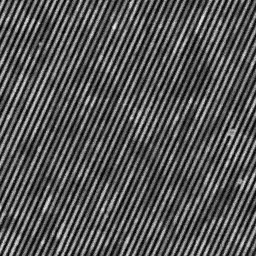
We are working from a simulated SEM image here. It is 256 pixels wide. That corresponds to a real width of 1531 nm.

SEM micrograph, parallel lines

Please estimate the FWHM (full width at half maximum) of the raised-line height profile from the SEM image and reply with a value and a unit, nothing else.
16.3 nm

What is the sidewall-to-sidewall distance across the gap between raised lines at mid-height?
20.4 nanometres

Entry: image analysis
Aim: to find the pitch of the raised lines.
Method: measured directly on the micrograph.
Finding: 0.0352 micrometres